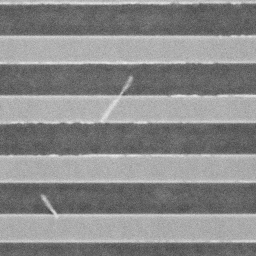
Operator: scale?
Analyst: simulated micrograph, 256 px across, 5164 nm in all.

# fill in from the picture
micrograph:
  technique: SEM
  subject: lines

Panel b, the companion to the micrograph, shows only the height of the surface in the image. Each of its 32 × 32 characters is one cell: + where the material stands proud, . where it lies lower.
................................
................................
................................
................................
.............................+++
++++++++++++++++++++++++++++++++
++++++++++++++++++++++++++++++++
++++++++++++++++++++++++++++++++
................................
................................
................................
................................
++++++++++++++++++++++++++++++++
++++++++++++++++++++++++++++++++
++++++++++++++++++++++++++++++++
................................
................................
................................
................................
......++..++++++++++++++++++++++
++++++++++++++++++++++++++++++++
++++++++++++++++++++++++++++++++
++++++++++++++++++++++++++++++++
................................
................................
................................
................................
++++++++++++++++++++++++++++++++
++++++++++++++++++++++++++++++++
++++++++++++++++++++++++++++++++
................................
................................